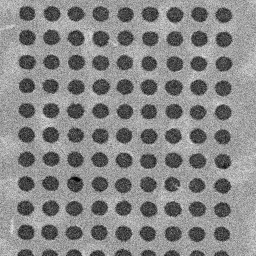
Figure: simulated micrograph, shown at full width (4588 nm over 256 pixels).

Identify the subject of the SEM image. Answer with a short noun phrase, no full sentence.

a regular array of holes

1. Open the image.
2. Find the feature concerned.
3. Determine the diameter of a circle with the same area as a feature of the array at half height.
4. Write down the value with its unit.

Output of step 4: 303 nanometres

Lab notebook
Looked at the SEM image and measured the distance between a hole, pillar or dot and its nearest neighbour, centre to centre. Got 430 nanometers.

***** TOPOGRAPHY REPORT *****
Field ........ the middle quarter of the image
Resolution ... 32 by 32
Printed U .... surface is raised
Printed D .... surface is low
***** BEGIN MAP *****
UDDDDUUDDDDUUDDDDUUDDDDUUUDDDDUU
UUDDUUUUDDDUUUUDUUUUDDDUUUDDDUUU
UUUUUUUUUUUUUUUUUUUUUUUUUUUUUUUU
UUUUUUUUUUUUUUUUUUUUUUUUUUUUUUUU
UDDDDUUDDDDUUDDDDUUDDDDUUUDDDUUU
UDDDDUUDDDDDUDDDDUUDDDDDUDDDDDUU
UDDDDUUDDDDUUDDDDUUDDDDUUDDDDDUU
UUDDUUUUDDDUUUDDUUUUDDDUUUDDDUUU
UUUUUUUUUUUUUUUUUUUUUUUUUUUUUUUU
UUUUUUUUUUUUUUUUUUUUUUUUUUUUUUUU
UDDDDUUDDDDUUUDDDUUUDDDUUUDDDUUU
UDDDDUUDDDDUUDDDDUUDDDDUUDDDDDUD
UDDDDUUDDDDUUDDDDUUDDDDUUDDDDDUD
UUDDUUUUDDUUUUDDUUUUDDDUUUDDDUUU
UUUUUUUUUUUUUUUUUUUUUUUUUUUUUUUU
UUUUUUUUUUUUUUUUUUUUUUUUUUUUUUUU
UDDDUUUUDDDUUUDDDUUUDDUUUUDDDUUU
UDDDDUUDDDDUUDDDDUUDDDDUUDDDDDUD
UDDDDUUDDDDUUDDDDUUDDDDDUDDDDDUU
UUDDUUUUDDDUUUDDDUUUDDDUUUDDDUUU
UUUUUUUUUUUUUUUUUUUUUUUUUUUUUUUU
UUUUUUUUUUUUUUUUUUUUUUUUUUUUUUUU
UDDDUUUDDDUUUUDDUUUUDDUUUUDDDUUU
UDDDDUUDDDDUUDDDDUUDDDDUUDDDDUUD
UDDDDUUDDDDUUDDDDUUDDDDUUDDDDDUD
UDDDUUUUDDUUUUDDDUUDDDDUUUDDDUUU
UUUUUUUUUUUUUUUUUUUUUUUUUUUUUUUU
UUUUUUUUUUUUUUUUUUUUUUUUUUUUUUUU
UDDDUUUUDDUUUUDDUUUUDDUUUUDDUUUU
UDDDDUUDDDDUUDDDDUUDDDDUUDDDDUUD
UDDDDUUDDDDUUDDDDUUDDDDUUDDDDUUD
UDDDUUUUDDDUUDDDDUUDDDDUUUDDUUUU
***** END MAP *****